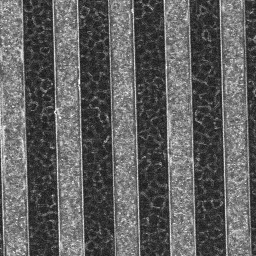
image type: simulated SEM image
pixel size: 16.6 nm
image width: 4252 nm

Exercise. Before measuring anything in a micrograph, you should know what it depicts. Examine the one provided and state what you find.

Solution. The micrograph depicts parallel lines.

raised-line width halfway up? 531 nanometers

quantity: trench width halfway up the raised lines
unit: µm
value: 0.403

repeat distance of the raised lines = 55.7 pixels